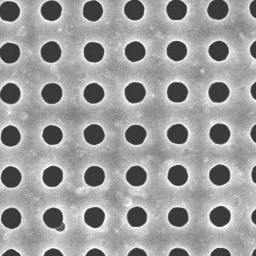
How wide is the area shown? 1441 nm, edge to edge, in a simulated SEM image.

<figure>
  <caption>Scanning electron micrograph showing a regular array of holes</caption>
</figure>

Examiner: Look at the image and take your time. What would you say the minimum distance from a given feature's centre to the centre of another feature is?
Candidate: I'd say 231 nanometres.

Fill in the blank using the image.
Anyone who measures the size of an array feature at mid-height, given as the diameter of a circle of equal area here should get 117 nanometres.